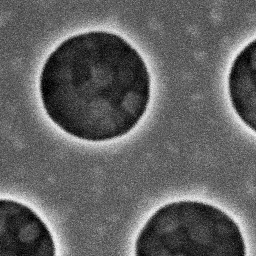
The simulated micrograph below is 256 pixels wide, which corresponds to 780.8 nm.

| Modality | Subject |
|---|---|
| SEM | holes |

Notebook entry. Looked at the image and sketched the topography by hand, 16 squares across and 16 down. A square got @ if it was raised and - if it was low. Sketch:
@@@@@@@@@@@@@@@@
@@@@@@@@@@@@@@@@
@@@@----@@@@@@@@
@@@------@@@@@@-
@@@------@@@@@--
@@-------@@@@@--
@@@------@@@@@@-
@@@------@@@@@@-
@@@@@---@@@@@@@@
@@@@@@@@@@@@@@@@
@@@@@@@@@@@@@@@@
@@@@@@@@@@@@@@@@
-@@@@@@@@@@-@@@@
--@@@@@@@-----@@
---@@@@@@------@
---@@@@@-------@